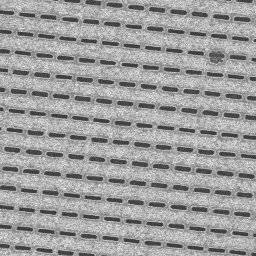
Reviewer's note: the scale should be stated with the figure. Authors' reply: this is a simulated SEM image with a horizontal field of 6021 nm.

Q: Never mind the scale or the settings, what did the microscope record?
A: a regular array of holes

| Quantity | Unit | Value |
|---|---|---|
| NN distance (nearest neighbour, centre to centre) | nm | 452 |